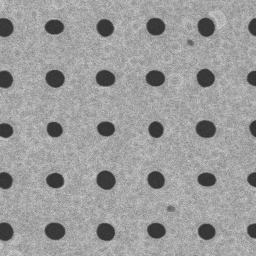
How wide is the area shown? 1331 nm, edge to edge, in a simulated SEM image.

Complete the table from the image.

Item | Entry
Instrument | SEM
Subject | a regular array of holes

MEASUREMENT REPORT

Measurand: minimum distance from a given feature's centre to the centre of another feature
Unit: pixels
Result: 50.4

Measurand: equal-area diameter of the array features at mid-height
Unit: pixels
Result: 17.3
